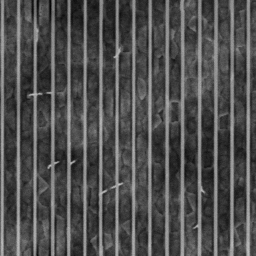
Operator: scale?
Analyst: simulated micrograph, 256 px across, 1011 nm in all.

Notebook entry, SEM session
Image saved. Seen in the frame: parallel lines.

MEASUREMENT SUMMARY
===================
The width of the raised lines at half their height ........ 0.0133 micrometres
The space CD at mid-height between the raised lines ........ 53.8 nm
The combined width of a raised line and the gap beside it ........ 16.4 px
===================